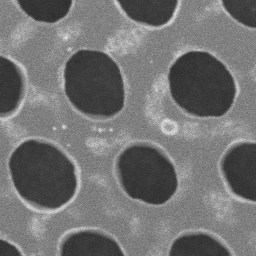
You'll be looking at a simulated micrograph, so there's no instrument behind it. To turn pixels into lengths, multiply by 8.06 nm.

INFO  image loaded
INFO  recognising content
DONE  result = holes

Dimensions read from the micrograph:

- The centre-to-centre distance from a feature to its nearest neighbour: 0.829 µm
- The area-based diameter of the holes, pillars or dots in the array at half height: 537 nm